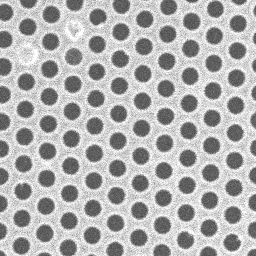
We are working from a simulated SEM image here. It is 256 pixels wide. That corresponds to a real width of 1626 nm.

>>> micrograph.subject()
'a regular array of holes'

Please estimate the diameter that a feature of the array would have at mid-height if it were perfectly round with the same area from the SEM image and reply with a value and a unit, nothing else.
112 nm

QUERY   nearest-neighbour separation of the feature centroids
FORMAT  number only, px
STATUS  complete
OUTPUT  26.7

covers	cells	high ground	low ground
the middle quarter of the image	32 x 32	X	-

XXXXXXX---XXX---XXX--XXX----XXXX
XXXXXX----XXXXXXXX----XXX-XXXX--
XXXXXX----XXXXXXXX----XXXXXXX---
X---XXX---XXX--XXX----XXXXXXX---
----XXXXXXXX----XXX--XXX---XXX--
----XXXXXXXX----XXXXXXX-----XXXX
X---XXX-XXXX----XXXXXXX-----XXXX
XXXXXX----XXX--XXX---XXX---XXXXX
XXXXXX----XXXXXXXX----XXXXXXXX--
XXXXXX----XXXXXXX-----XXXXXXX---
----XXX--XXXX--XXX---XXXXXXXX---
----XXXXXXXX----XXX-XXXX---XXX--
----XXXXXXX-----XXXXXXX-----XXXX
X--XXXX--XXX----XXXXXXX-----XXXX
XXXXXX----XXX--XXX---XXX---XXXX-
XXXXXX----XXXXXXX-----XXXXXXX---
XX-XXX----XXXXXXX-----XXXXXXX---
----XXX--XXX---XXX---XXXXXXXX---
----XXXXXXX-----XXXXXXX----XXX--
----XXXXXXX-----XXXXXXX----XXXXX
---XXX---XXX---XXXXXXXX----XXXXX
XXXXXX----XXX-XXXX---XXX---XXX--
XXXXX-----XXXXXXX----XXXXXXXX---
X--XXX----XXXXXXX----XXXXXXXX---
----XXX-XXXX---XXX---XXXXXXXX---
----XXXXXXX----XXXXXXXX----XXX--
----XXXXXXX-----XXXXXXX----XXXXX
X--XXX---XXX---XXXXXXXX----XXXXX
XXXXX----XXXXXXXX----XXX--XXX---
XXXXX-----XXXXXXX----XXXXXXXX---
--XXXX---XXXXXXXX----XXXXXXX----
---XXXXXXXXX---XXX--XXXX--XXX---